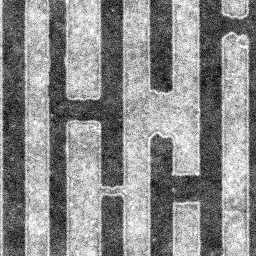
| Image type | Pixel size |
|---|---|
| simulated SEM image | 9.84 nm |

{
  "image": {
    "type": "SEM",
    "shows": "parallel lines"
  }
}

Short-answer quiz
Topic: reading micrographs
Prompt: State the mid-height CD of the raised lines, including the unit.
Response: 244 nm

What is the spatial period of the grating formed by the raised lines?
485 nm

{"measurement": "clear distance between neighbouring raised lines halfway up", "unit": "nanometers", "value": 244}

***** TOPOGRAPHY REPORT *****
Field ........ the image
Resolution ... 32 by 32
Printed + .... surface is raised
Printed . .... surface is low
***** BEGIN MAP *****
+++...++....+++....+++...+++...+
+++...++....+++....+++...+++...+
+++...++....+++....+++...+++++++
+++...++....+++....+++...+++++++
+++...++....+++....+++...+++..++
+++...++....+++....+++...+++..++
+++...++....+++....+++...+++...+
+++...++....+++....+++...+++...+
+++...++....+++....+++...+++...+
+++...++....+++....+++...+++...+
+++...++....+++....+++...+++...+
+++...++....+++....++....+++...+
+++...+++++++++..........+++...+
+++...+++++++++..........+++...+
+++...+++++++++..........+++...+
+++...+++...+++..........+++...+
+++...++....+++..........+++...+
+++...++....+++....+++...+++...+
+++...++....+++....+++...+++...+
+++...++....+++....+++...+++...+
+++...++....+++....+++...+++...+
+++...++....+++....+++...+++...+
+++...++....+++....+++++++++...+
+++...++.....+.....+++++++++...+
+++...++.....++....+++++++++...+
+++...++.....++....+++...+++...+
+++...++.....++....+++...+++...+
+++...++.....++....+++...+++...+
+++...++.....++....+++...+++...+
+++...++.....++....+++...+++...+
+++...++.....++....+++...+++...+
+++...++.....++....+++...+++...+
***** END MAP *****